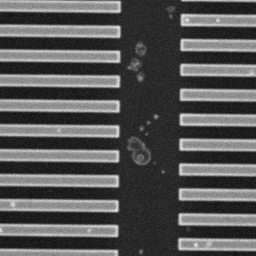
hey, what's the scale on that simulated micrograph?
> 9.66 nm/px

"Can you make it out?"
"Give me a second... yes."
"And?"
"groups of lines, slits or small figures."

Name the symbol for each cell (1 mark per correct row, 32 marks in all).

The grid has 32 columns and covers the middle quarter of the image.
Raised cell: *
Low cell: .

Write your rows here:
.............................***
.............................***
.............................***
**************..................
**************..................
...***********..................
.............................***
.............................***
.............................***
**************..................
**************..................
**************..................
................................
.............................***
.............................***
********........................
**************..................
**************..................
................................
.............................***
.............................***
................................
**************..................
**************..................
................................
.............................***
.............................***
.............................***
*************...................
*************...................
......*******...................
.............................***